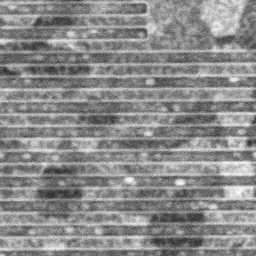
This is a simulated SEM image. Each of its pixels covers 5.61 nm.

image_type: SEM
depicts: parallel lines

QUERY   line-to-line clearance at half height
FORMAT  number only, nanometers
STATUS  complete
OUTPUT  70.2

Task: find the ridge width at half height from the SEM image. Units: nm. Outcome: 70.2